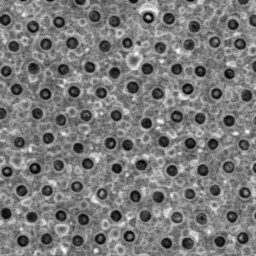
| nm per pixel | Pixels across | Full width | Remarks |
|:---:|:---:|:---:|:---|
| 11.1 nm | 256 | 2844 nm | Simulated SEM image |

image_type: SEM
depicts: a regular array of holes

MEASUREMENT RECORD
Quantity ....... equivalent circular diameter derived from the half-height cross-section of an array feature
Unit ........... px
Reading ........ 12.2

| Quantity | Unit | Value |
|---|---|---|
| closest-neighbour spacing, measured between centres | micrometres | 0.262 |